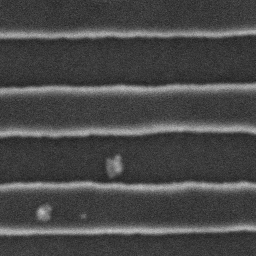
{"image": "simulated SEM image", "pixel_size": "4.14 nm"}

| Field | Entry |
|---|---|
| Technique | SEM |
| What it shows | lines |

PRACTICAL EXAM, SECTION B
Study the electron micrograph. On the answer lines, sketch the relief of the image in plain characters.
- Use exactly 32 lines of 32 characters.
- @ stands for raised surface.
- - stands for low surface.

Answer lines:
@@@@@@@@@@@@@@@@@@@@@@@@@@@@@@@@
@@@@@@@@@@@@@@@@@@@@@@@@@@@@@@@@
@@@@@@@@@@@@@@@@@@@@@@@@@@@@@@@@
@@@@@@@@@@@@@@@@@@@@@@@@@@@@@@@@
@@@@@@@@@@@@--@@@---@@----@-----
--------------------------------
--------------------------------
--------------------------------
--------------------------------
--------------------------------
--------------------------------
@@@@@@@@@@@@@@@@@@@@@@@@@@@@@@@@
@@@@@@@@@@@@@@@@@@@@@@@@@@@@@@@@
@@@@@@@@@@@@@@@@@@@@@@@@@@@@@@@@
@@@@@@@@@@@@@@@@@@@@@@@@@@@@@@@@
@@@@@@@@@@@@@@@@@@@@@@@@@@@@@@@@
@@@@@@@@@@@@@@@@@@@------------@
--------------------------------
--------------------------------
--------------------------------
--------------------------------
--------------------------------
--------------------------------
@@@@@@@@@@@@@@@@@@@@@@@@@@@@@@@@
@@@@@@@@@@@@@@@@@@@@@@@@@@@@@@@@
@@@@@@@@@@@@@@@@@@@@@@@@@@@@@@@@
@@@@@@@@@@@@@@@@@@@@@@@@@@@@@@@@
@@@@@@@@@@@@@@@@@@@@@@@@@@@@@@@@
@@@@@@@@@@@@@@@@@@@@@@@@@@@@@@@@
--------------------------------
--------------------------------
--------------------------------